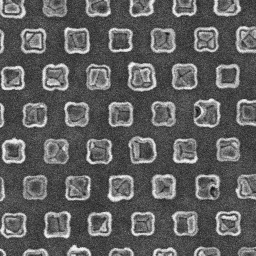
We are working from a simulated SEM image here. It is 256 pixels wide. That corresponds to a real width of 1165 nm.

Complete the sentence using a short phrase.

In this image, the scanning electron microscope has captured a regular array of raised bodies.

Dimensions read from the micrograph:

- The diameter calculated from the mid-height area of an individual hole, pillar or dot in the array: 119 nm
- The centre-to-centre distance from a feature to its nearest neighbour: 42 px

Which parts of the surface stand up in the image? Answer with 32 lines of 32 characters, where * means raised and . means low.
***...**...***..***...**...***..
***...**...***..***...**...***..
................................
..........................*...**
...***..***...**...***..***...**
...***..***...**...***..***...**
...**....**.........*...........
................................
.**...**...***..***...**...***..
***..***...***..***...***..***..
***..****..***..***...***..***..
................................
.........................**...*.
...***..***...**...***...**...**
...***..***...***..***...**...**
...***..***...**...***...**...**
................................
.**...**...*....***...**...***..
***...**...***..***...***..***..
***...**...***..***...***..***..
................................
................................
...***..***...***..***...**...**
...***..***...***..***...**...**
*..***..***...***..***...*....**
................................
......................**....**..
***...***..***..***...***..***..
***...***..***..***...***..***..
.**...***.......................
................................
*..***...**...***..***..***...**